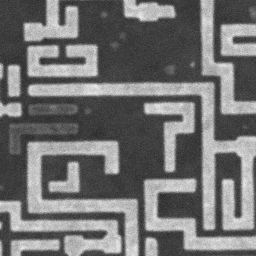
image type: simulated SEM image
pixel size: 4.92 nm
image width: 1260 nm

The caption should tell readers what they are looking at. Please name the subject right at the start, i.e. wiring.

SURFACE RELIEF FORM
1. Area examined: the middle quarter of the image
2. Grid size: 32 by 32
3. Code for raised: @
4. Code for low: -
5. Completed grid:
@@@@@@@@------------------------
@@@@@@@@------------------------
@@@@@@@@------------------------
--------------------------------
--------------------------------
@@@@@@@@@@@@@@@@@@@@@@@@@@@@@@@@
@@@@@@@@@@@@@@@@@@@@@@@@@@@@@@@@
@@@@@@@@@---@@@@@@@@@@@@--------
--------------------------------
--------------------------------
@@@-----------------@@@@@@@@@@@@
@@@-----------------@@@@@@@@@@@@
------------------------------@@
------------------------------@@
------------------------------@@
@@@----------------------@@@@@@@
@@@----------------------@@@@@@@
-------------------------@@@----
-------------------------@@@----
-------------------------@@@----
@@@@@@@@@@@@@-------------@@----
@@@@@@@@@@@@@-------------@-----
----------@@@-------------@-----
----------@@@-------------@-----
----------@@@-------------@-----
-@@-------@@@-------------@-----
-@@-------@@@-------------@-----
-@@-----------------------------
-@@-----------------------------
-@@@----------------@@@@@@@@@@@@
@@@@----------------@@@@@@@@@@@@
@@@-----------------@@@@@@@@@@@@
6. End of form